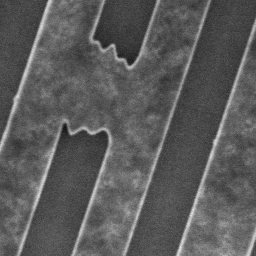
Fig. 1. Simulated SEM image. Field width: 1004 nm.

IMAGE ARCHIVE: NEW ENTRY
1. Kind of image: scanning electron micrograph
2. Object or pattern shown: one or a few lines or trenches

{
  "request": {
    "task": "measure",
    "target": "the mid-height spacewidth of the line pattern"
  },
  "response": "50.1 pixels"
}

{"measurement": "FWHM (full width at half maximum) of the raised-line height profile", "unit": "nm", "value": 193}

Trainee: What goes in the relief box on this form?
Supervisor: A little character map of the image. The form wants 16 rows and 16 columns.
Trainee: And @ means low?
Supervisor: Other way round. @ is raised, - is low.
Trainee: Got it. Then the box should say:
---@@@----@@@---
---@@@---@@@@---
--@@@@---@@@----
--@@@@@--@@@---@
--@@@@@@@@@@---@
-@@@@@@@@@@----@
-@@@@@@@@@@---@@
-@@@@@@@@@@---@@
@@@@---@@@----@@
@@@----@@@---@@@
@@@---@@@@---@@@
@@@---@@@----@@@
@@----@@@---@@@@
@@---@@@@---@@@@
@@---@@@----@@@@
@----@@@---@@@@@